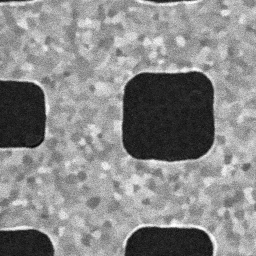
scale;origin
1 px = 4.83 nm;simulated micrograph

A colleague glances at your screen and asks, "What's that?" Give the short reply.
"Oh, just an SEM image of holes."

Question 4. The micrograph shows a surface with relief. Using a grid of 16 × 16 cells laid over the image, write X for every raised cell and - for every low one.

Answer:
XXXXXXXXXXXXXXXX
XXXXXXXXXXXXXXXX
XXXXXXXXXXXXXXXX
XXXXXXXXXXXXXXXX
XXXXXXXXXXX--XXX
--XXXXXX-----XXX
---XXXXX-----XXX
---XXXXX-----XXX
---XXXXX-----XXX
XXXXXXXX-----XXX
XXXXXXXXXXXXXXXX
XXXXXXXXXXXXXXXX
XXXXXXXXXXXXXXXX
XXXXXXXXXXXXXXXX
---XXXXX-----XXX
---XXXXX-----XXX